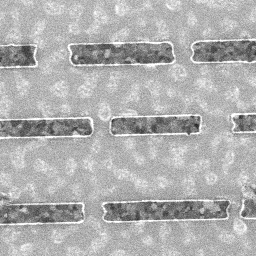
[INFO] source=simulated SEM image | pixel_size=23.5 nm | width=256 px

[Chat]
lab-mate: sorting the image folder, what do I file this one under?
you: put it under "one or a few lines or trenches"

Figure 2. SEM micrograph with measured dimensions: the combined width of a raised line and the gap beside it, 1880 nanometers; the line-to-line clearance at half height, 1480 nanometers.